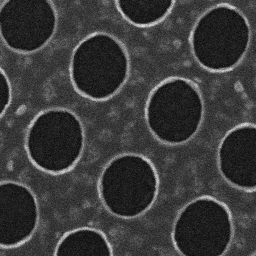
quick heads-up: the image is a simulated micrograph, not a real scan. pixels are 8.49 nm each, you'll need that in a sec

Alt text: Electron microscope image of holes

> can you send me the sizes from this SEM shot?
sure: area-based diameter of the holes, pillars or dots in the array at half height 497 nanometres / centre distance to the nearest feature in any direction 728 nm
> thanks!